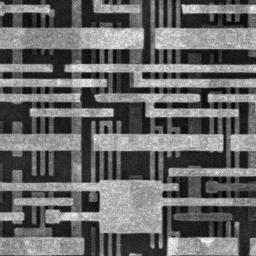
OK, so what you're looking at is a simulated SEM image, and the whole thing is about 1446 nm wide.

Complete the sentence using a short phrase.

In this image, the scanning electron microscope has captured wiring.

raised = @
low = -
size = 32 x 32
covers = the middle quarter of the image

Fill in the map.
@@@@@@@@@@@@@@@@@@@@@@@@@@@@@@@@
@@@@@@@@@@@@@@@@@@@@@@@@@@@@@@@@
------------------@-------------
------------------@@------------
@@@@@@@@@@@-------@@@@@@@@@@@@@@
@@@@@@@@@@@-------@@@@@@@@@@@@@@
--------------------------------
@@@@-----@@@@@@@@@@---@@@@----@@
@@@@----@@@@@@@@@@@@@@@@@@@@@@@@
--------------------@@@---------
--------------------@@----------
@@@@@@@@@@@@--------@@@@@@@@@@@@
@@@@@@@@@@@@--------@@@@@@@@@@@@
--------------------------------
--------------------------------
--------------------------------
--------------------------------
--------------------------------
@@@@---@@@@@@@@@@@@@@@@@@@@@@@@@
@@@@---@@@@@@@@@@@@@@@@@@@@@@@@@
@@@@---@@@@@@@@@@@@@@@@@@@@@@@@@
@@@@---@@@@@@@@@@@@@@@@@@@@@@@@@
--------------------------------
--------------------------------
--------------------------------
--------------------------------
--------------------------@@@@@@
--------------------------@@@@@@
--------------------------------
---------@@@@@@@@@@@@@@@--------
@@@@@@@@@@@@@@@@@@@@@@@@@@@@----
@@@@@@@@@@@@@@@@@@@@@@@@@@@@----